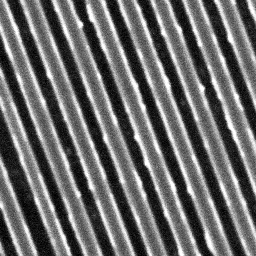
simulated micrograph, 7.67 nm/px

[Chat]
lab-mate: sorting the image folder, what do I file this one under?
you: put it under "parallel lines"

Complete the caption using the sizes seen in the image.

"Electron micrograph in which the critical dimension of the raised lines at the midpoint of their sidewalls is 0.131 microns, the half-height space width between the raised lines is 98.8 nm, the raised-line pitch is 0.232 um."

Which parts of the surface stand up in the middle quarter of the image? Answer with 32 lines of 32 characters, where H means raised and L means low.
LLLLHHHHLLLLHHHHLLLLHHHHHLLLHHHH
LLLLHHHHLLLLHHHHLLLLHHHHHLLLHHHH
LLLLHHHHHLLLHHHHHLLLHHHHHLLLLHHH
HLLLLHHHHLLLLHHHHLLLLHHHHHLLLHHH
HLLLLHHHHLLLLHHHHHLLLHHHHHLLLLHH
HHLLLHHHHHLLLHHHHHHLLHHHHHHLLLHH
HHLLLLHHHHLLLLHHHHHLLLHHHHHLLLHH
HHLLLLHHHHHLLLHHHHHLLLHHHHHLLLHH
HHHLLLHHHHHLLLLHHHHLLLLHHHHLLLLH
HHHLLLLHHHHLLLLHHHHHLLLHHHHHLLLH
HHHHLLLHHHHHLLLHHHHHLLLHHHHHLLLL
HHHHLLLLHHHHLLLLHHHHLLLLHHHHLLLL
HHHHLLLLHHHHLLLLHHHHLLLLHHHHHLLL
HHHHHLLLHHHHHLLLHHHHHLLLLHHHHLLL
LHHHHLLLLHHHHLLLLHHHHLLLLHHHHHLL
LHHHHHLLLHHHHLLLLHHHHHLLLHHHHHLL
LHHHHHLLLHHHHHLLLHHHHHLLLLHHHHLL
LLHHHHLLLLHHHHLLLLHHHHLLLLHHHHHL
LLHHHHLLLLHHHHHLLLHHHHHLLLHHHHHL
LLLHHHHLLLHHHHHLLLHHHHHLLLLHHHHL
LLLHHHHLLLLHHHHLLLLHHHHLLLLHHHHH
LLLHHHHHLLLHHHHHLLLHHHHHLLLHHHHH
LLLLHHHHLLLLHHHHLLLLHHHHLLLLHHHH
HLLLHHHHHLLLHHHHHLLLHHHHHLLLHHHH
HLLLHHHHHLLLLHHHHLLLHHHHHLLLLHHH
HLLLLHHHHLLLLHHHHLLLLHHHHLLLLHHH
HLLLLHHHHHLLLHHHHHLLLHHHHHLLLHHH
HHLLLHHHHHLLLLHHHHLLLLHHHHLLLLHH
HHLLLLHHHHLLLLHHHHHLLLHHHHHLLLHH
HHHLLLHHHHHLLLHHHHHLLLLHHHHLLLLH
HHHLLLHHHHHLLLLHHHHLLLLHHHHHLLLH
HHHLLLLHHHHLLLLHHHHHLLLHHHHHLLLH